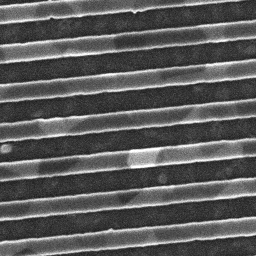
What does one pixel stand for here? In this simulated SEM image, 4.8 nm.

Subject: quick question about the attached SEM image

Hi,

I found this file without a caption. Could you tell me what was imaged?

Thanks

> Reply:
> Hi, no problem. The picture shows parallel lines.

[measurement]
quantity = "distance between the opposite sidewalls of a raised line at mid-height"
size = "82.5 nanometers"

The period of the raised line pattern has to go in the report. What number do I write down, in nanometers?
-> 188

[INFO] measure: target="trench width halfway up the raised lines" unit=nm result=109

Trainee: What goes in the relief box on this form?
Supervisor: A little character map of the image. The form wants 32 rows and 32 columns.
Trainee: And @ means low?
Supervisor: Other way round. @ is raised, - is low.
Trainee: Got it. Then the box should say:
----@@@@@@@@@@@@@@@@@@@@@-------
@@@@@@@@@@@@@@@-----------------
@@@@----------------------------
-----------------------@@@@@@@@@
-------------@@@@@@@@@@@@@@@@@@@
---@@@@@@@@@@@@@@@@@@@@@--------
@@@@@@@@@@@@@@------------------
@@@@----------------------------
---------------------@@@@@@@@@@@
------------@@@@@@@@@@@@@@@@@@@@
--@@@@@@@@@@@@@@@@@@@@@---------
@@@@@@@@@@@@@-------------------
@@@----------------------------@
---------------------@@@@@@@@@@@
-----------@@@@@@@@@@@@@@@@@@@@@
-@@@@@@@@@@@@@@@@@@@@@----------
@@@@@@@@@@@@--------------------
@-----------------------------@@
@-------------------@@@@@@@@@@@@
---------@@@@@@@@@@@@@@@@@@@@@@@
@@@@@@@@@@@@@@@@@@@@@-----------
@@@@@@@@@@@---------------------
@----------------------------@@@
-------------------@@@@@@@@@@@@@
----------@@@@@@@@@@@@@@@@@@@@--
@@@@@@@@@@@@@@@@@@@@@-----------
@@@@@@@@@@----------------------
-----------------------------@@@
------------------@@@@@@@@@@@@@@
--------@@@@@@@@@@@@@@@@@@@@@@--
@@@@@@@@@@@@@@@@@@@-------------
@@@@@@@@@-----------------------